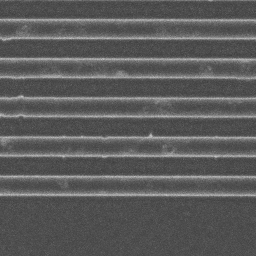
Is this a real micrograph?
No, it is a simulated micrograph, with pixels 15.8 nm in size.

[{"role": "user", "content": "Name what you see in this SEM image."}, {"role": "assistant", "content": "parallel lines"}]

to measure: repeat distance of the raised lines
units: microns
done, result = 0.62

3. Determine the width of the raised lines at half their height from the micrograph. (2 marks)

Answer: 305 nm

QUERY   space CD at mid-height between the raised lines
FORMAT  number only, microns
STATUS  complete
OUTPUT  0.319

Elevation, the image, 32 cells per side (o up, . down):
................................
................................
................................
oooooooooooooooooooooooooooooooo
oooooooooooooooooooooooooooooooo
................................
................................
oooooooooooooooooooooooooooooooo
oooooooooooooooooooooooooooooooo
oooooooooooooooooooooooooooooooo
................................
................................
oooooooooooooooooooooooooooooooo
oooooooooooooooooooooooooooooooo
oooooooooooooooooooooooooooooooo
................................
................................
oooooooooooooooooooooooooooooooo
oooooooooooooooooooooooooooooooo
.......oo...oooooooooooooooooooo
................................
................................
oooooooooooooooooooooooooooooooo
oooooooooooooooooooooooooooooooo
................................
................................
................................
................................
................................
................................
................................
................................